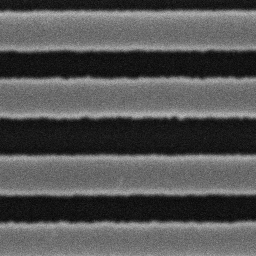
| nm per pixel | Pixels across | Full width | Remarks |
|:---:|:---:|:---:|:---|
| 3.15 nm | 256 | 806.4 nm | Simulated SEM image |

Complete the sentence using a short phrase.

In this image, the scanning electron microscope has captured lines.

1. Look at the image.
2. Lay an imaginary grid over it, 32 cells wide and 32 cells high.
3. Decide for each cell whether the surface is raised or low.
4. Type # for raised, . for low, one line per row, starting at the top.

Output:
................................
################################
################################
################################
################################
################################
................................
................................
................................
................................
################################
################################
################################
################################
################################
................................
................................
................................
................................
..#..###########.####.##########
################################
################################
################################
################################
................................
................................
................................
................................
################################
################################
################################
################################